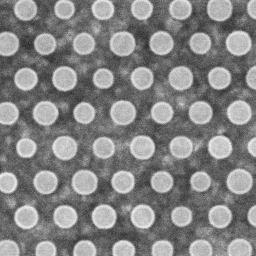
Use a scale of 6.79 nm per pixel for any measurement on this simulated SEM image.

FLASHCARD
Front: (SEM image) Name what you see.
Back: a regular array of raised bodies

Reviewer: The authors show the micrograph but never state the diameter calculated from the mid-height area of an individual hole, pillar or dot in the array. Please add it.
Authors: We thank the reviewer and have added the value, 0.147 um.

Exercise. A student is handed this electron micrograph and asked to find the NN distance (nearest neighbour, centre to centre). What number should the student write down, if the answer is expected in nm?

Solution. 262